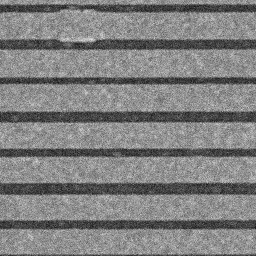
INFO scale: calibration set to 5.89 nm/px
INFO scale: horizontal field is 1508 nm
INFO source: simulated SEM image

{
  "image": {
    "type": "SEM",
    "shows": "parallel lines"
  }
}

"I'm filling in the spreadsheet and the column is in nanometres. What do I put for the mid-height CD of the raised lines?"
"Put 151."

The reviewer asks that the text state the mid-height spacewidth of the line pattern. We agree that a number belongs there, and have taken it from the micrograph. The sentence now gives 56.7 nm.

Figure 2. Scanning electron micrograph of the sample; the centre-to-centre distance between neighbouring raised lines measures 212 nm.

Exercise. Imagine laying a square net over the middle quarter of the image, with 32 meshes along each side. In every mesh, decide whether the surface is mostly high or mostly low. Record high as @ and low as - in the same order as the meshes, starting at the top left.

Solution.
@@@@@@@@@@@@@@@@@@@@@@@@@@@@@@@@
@@@@@@@@@@@@@@@@@@@@@@@@@@@@@@@@
@@@@@@@@@@@@@@@@@@@@@@@@@@@@@@@@
--------------------------------
-------@------------------------
@@@@@@@@@@@@@@@@@@@@@@@@@@@@@@@@
@@@@@@@@@@@@@@@@@@@@@@@@@@@@@@@@
@@@@@@@@@@@@@@@@@@@@@@@@@@@@@@@@
@@@@@@@@@@@@@@@@@@@@@@@@@@@@@@@@
@@@@@@@@@@@@@@@@@@@@@@@@@@@@@@@@
@@@@@@@@@@@@@@@@@@@@@@@@@@@@@@@@
@@@@@@@@@@@@@@@@@@@@@@@@@@@@@@@@
--------------------------------
-----------------@--------------
------------------------@-------
@@@@@@@@@@@@@@@@@@@@@@@@@@@@@@@@
@@@@@@@@@@@@@@@@@@@@@@@@@@@@@@@@
@@@@@@@@@@@@@@@@@@@@@@@@@@@@@@@@
@@@@@@@@@@@@@@@@@@@@@@@@@@@@@@@@
@@@@@@@@@@@@@@@@@@@@@@@@@@@@@@@@
@@@@@@@@@@@@@@@@@@@@@@@@@@@@@@@@
--------------------------------
-------------@-----------@------
@@@@@@@@@@@@@@@@@@@@@@@@@@@@@@@@
@@@@@@@@@@@@@@@@@@@@@@@@@@@@@@@@
@@@@@@@@@@@@@@@@@@@@@@@@@@@@@@@@
@@@@@@@@@@@@@@@@@@@@@@@@@@@@@@@@
@@@@@@@@@@@@@@@@@@@@@@@@@@@@@@@@
@@@@@@@@@@@@@@@@@@@@@@@@@@@@@@@@
@@@@@@@@@@@@@@@@@@@@@@@@@@@@@@@@
---@----------------------------
--------------------------------